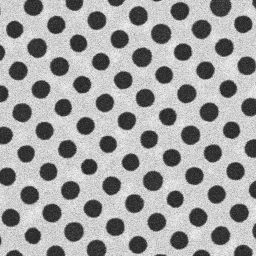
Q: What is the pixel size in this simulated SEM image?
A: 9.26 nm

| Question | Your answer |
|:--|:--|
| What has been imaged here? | a regular array of holes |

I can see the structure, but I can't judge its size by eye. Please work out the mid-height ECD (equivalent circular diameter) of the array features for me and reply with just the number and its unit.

172 nanometres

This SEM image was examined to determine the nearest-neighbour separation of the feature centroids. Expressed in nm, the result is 267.